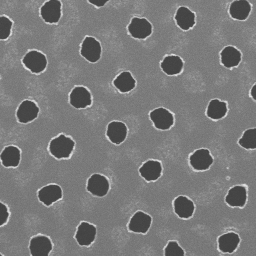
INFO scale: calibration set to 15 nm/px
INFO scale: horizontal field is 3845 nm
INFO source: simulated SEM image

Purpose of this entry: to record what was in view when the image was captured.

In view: a regular array of holes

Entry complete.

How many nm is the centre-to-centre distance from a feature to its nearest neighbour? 720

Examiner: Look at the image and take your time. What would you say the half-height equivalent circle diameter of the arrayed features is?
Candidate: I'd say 319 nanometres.